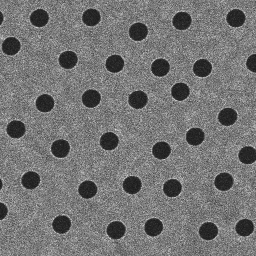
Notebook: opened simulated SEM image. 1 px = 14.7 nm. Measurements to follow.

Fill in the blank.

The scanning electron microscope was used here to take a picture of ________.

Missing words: a regular array of holes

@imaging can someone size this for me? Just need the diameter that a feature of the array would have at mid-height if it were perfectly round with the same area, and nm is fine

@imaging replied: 264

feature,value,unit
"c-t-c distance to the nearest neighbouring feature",585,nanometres